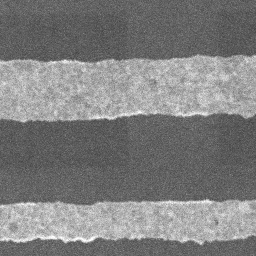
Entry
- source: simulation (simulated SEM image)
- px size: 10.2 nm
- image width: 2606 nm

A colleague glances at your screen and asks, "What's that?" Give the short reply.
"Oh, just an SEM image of one or a few lines or trenches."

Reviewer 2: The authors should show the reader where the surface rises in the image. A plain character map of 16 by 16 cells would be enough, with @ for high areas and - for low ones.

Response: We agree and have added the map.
----------------
----------------
----------------
----------------
@@@@@@@@@@@@@@@@
@@@@@@@@@@@@@@@@
@@@@@@@@@@@@@@@@
-@--------------
----------------
----------------
----------------
----------------
----------------
@@@@@@@@@@@@@@@@
@@@@@@@@@@@@@@@@
----------------